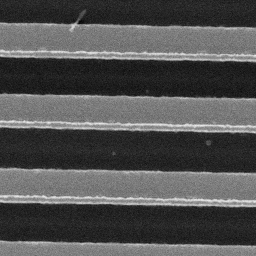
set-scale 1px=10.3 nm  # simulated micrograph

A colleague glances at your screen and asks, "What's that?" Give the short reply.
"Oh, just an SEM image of lines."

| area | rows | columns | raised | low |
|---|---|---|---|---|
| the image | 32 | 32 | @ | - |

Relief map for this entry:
--------------------------------
--------------------------------
--------------------------------
@@@@@@@@@@@@@@@@@@@@@@@@@@------
@@@@@@@@@@@@@@@@@@@@@@@@@@@@@@@@
@@@@@@@@@@@@@@@@@@@@@@@@@@@@@@@@
@@@@@@@@@@@@@@@@@@@@@@@@@@@@@@@@
---------------------------@-@@@
--------------------------------
--------------------------------
--------------------------------
--------------------------------
@@@@@@@@@@@@@@@@@@@@@@@@@@@@@@@@
@@@@@@@@@@@@@@@@@@@@@@@@@@@@@@@@
@@@@@@@@@@@@@@@@@@@@@@@@@@@@@@@@
@@@@@@@@@@@@@@@@@@@@@@@@@@@@@@@@
-------------------------------@
--------------------------------
--------------------------------
--------------------------------
--------------------------------
@@@@@@@@@@@@@@@@@@@@------------
@@@@@@@@@@@@@@@@@@@@@@@@@@@@@@@@
@@@@@@@@@@@@@@@@@@@@@@@@@@@@@@@@
@@@@@@@@@@@@@@@@@@@@@@@@@@@@@@@@
---------------@@@@@@@@@@@@@@@@@
--------------------------------
--------------------------------
--------------------------------
--------------------------------
@@@@@@@@@@@@--------------------
@@@@@@@@@@@@@@@@@@@@@@@@@@@@@@@@